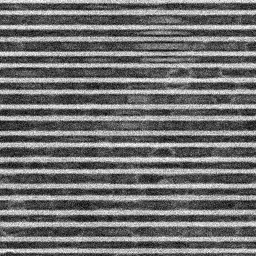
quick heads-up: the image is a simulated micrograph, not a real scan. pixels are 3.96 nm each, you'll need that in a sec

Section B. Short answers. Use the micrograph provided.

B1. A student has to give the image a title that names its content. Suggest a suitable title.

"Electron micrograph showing parallel lines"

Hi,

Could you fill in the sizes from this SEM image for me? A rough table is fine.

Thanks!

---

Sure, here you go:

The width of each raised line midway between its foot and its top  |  13.9 nm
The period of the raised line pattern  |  13.3 pixels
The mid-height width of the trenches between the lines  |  34.7 nm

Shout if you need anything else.